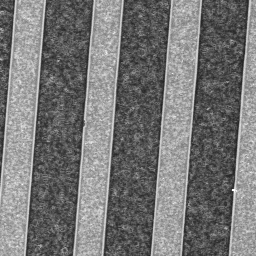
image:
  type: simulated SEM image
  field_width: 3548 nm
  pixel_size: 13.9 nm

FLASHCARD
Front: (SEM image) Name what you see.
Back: one or a few lines or trenches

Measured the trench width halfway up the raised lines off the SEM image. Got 675 nm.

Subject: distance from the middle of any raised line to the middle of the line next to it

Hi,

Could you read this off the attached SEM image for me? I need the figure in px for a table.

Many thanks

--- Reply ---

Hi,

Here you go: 77.8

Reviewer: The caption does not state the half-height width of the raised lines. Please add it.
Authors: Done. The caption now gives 0.404 micrometres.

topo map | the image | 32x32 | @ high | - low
--@@@@------@@@------@@@@------@
--@@@-------@@@------@@@@------@
--@@@-------@@@------@@@@------@
--@@@-------@@@------@@@@------@
--@@@------@@@@------@@@@------@
--@@@------@@@@------@@@@------@
-@@@@------@@@@------@@@@------@
-@@@@------@@@@------@@@@------@
-@@@@------@@@@------@@@-------@
-@@@@------@@@-------@@@------@@
-@@@@------@@@-------@@@------@@
-@@@@------@@@-------@@@------@@
-@@@@------@@@-------@@@------@@
-@@@@------@@@------@@@@------@@
-@@@-------@@@------@@@@------@@
-@@@-------@@@------@@@@------@@
-@@@------@@@@------@@@@------@@
-@@@------@@@@------@@@@------@@
-@@@------@@@@------@@@@------@@
@@@@------@@@@------@@@@------@@
@@@@------@@@@------@@@@------@@
@@@@------@@@@------@@@-------@@
@@@@------@@@@------@@@-------@@
@@@@------@@@@------@@@------@@@
@@@@------@@@-------@@@------@@@
@@@@------@@@-------@@@------@@@
@@@-------@@@------@@@@------@@@
@@@-------@@@------@@@@------@@@
@@@-------@@@------@@@@------@@@
@@@-------@@@------@@@@------@@@
@@@------@@@@------@@@@------@@@
@@@------@@@@------@@@@------@@@